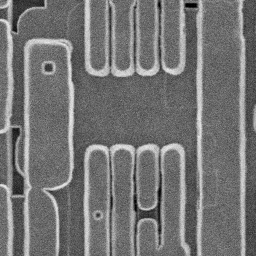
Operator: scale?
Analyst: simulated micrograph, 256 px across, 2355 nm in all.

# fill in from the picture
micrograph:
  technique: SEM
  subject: wiring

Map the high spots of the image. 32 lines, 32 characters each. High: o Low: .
o..........oooooooooooo..ooooo..
...........oooooooooooo..ooooo..
...........oooooooooooo..ooooo..
o..........oooooooooooo..ooooo..
o..........oooooooooooo..ooooo..
o...ooooo..oooooooooooo..ooooo..
o..oooooo..oooooooooooo..ooooo..
o..oooooo..oooooooooooo..ooooo..
o..oooooo..ooooooooo.oo..ooooo..
o..oooooo................ooooo..
o..oooooo................ooooo..
o..oooooo................ooooo..
o..oooooo................ooooo..
o..oooooo................ooooo..
o..oooooo................ooooo..
o..oooooo................ooooo..
o..oooooo................ooooo..
...oooooo................ooooo..
...oooooo..oo.oo..o..o...ooooo..
...oooooo..oooooooooooo..ooooo..
...oooooo..oooooooooooo..ooooo..
...oooooo..oooooooooooo..ooooo..
...oooooo..oooooooooooo..ooooo..
o..oooo....oooooooooooo..ooooo..
o..ooo.....oooooooooooo..ooooo..
o..oooo....oooooooooooo..ooooo..
o..oooo....oooooo...ooo..ooooo..
o..oooo....oooooo.o.ooo..ooooo..
o..oooo....oooooooooooo..ooooo..
o..oooo....oooooooooooo..ooooo..
o..oooo....oooooooooooo..ooooo..
o..oooo....oooooooooooo..ooooo..